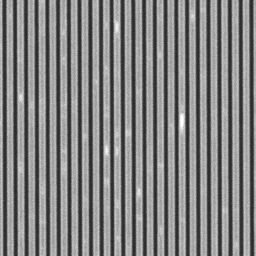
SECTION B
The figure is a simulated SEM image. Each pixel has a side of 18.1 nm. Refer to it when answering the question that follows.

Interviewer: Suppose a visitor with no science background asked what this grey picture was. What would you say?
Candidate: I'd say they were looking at parallel lines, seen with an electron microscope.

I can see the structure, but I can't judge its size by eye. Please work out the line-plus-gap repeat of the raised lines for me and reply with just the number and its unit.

194 nm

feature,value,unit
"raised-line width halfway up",111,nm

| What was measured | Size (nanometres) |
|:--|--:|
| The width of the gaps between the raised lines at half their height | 79.1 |